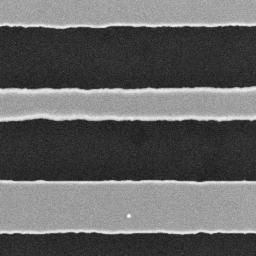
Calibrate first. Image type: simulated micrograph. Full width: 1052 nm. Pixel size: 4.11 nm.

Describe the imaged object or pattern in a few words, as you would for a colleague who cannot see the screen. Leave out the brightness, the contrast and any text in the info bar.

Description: lines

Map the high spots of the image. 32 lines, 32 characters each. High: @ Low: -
@@@@@@@@@@@@@@@@@@@@@@@@@@@@@@@@
@@@@@@@@@@@@@@@@@@@@@@@@@@@@@@@@
@@@@@@@@@@@@@@@@@@@@@@@@@@@@@@@@
------@@------------------------
--------------------------------
--------------------------------
--------------------------------
--------------------------------
--------------------------------
--------------------------------
--------------------------------
@@@@@@@@@@@@@@@@@@@@@@@@@@@@@@@@
@@@@@@@@@@@@@@@@@@@@@@@@@@@@@@@@
@@@@@@@@@@@@@@@@@@@@@@@@@@@@@@@@
@@@@@@@@@@@@@@@@@@@@@@@@@@@@@@@@
--------------------------------
--------------------------------
--------------------------------
--------------------------------
--------------------------------
--------------------------------
--------------------------------
--------------------------------
@@@@@@@@@@@@@@@@@@@@@@@@@@@@@@@@
@@@@@@@@@@@@@@@@@@@@@@@@@@@@@@@@
@@@@@@@@@@@@@@@@@@@@@@@@@@@@@@@@
@@@@@@@@@@@@@@@@@@@@@@@@@@@@@@@@
@@@@@@@@@@@@@@@@@@@@@@@@@@@@@@@@
@@@@@@@@@@@@@@@@@@@@@@@@@@@@@@@@
--------------------------------
--------------------------------
--------------------------------